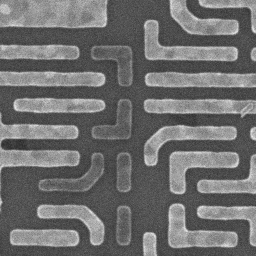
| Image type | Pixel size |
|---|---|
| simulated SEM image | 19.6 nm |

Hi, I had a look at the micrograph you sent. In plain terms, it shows wiring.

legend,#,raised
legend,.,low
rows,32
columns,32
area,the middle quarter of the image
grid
..............###...............
..............###...............
##########....###....#########..
##########....###...############
##########....###...############
.........................######.
................................
................................
................................
##########....###...############
##########....###...############
##########...####...############
.............####...............
.............####...............
.............####...............
###.....#########...........##..
###....##########.......########
###....#########.......#########
###.....########......##########
.....................####.......
....................####........
....................###.........
####...##.....##....###....#####
####...###...###....###....#####
####...###...####...###....#####
.......###...####..........#####
......####...####..........###..
......###....###...........###..
....#####....###...........###..
########.....###...........###..
#######......###...........###..
######........##...........###..